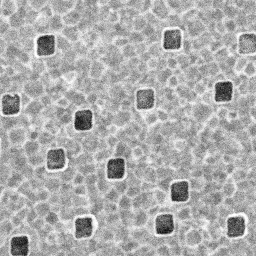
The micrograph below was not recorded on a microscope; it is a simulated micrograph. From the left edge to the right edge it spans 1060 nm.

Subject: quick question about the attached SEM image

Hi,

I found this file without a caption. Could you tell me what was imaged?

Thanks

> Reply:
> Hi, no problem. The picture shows a regular array of holes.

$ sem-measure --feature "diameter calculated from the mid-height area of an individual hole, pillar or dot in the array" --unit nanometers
94.6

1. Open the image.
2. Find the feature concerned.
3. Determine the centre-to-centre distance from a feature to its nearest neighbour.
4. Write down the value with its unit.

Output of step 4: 271 nm